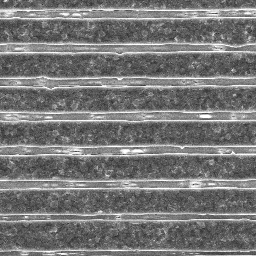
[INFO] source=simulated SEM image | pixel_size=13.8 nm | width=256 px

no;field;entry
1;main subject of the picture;parallel lines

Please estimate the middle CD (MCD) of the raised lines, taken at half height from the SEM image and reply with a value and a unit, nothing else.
366 nm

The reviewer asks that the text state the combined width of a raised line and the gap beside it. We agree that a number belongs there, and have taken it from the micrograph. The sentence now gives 0.468 µm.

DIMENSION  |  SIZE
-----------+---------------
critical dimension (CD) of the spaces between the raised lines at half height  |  7.5 px